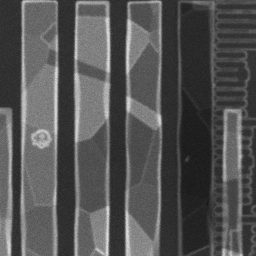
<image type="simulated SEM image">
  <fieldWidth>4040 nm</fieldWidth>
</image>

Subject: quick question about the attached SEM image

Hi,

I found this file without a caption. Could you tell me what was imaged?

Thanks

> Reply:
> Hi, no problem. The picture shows wiring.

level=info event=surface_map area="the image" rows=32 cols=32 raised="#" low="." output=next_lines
...####...###...####..####......
...####...###...####..####......
...####...###...####..####......
...####...###...####..####......
...####...###...####..#####.....
...####...####..####..#####.....
...####...####..####..#####.....
...####...####..####..####......
...####...###...####..#####.....
...####...###...####..#####.....
...####...###...####..#####.....
...####...###...####..#####.....
...####...###...####...####.....
...####...###...####...####.....
#..####...###...####..#####.##..
#..####...###...####..#####.##..
#..####...####..####..#####.##..
#..####...####..####..#####.##..
#..####...####..####..#####.##..
#..####...###...####..#####.##..
#..####...###...####..#####.##..
#..####...###...####..#####.##..
#..####...###...####..#####.##..
#..####...###...####..#####.##..
#..####...###...####..####..##..
#..####...###...####..####..##..
#..####...###...####..####..##..
#..####...###...####..####..##..
#..####...###...####...###..##..
#..####...###...####...###..#...
#..####...###...####...###..#...
#..####...###...###....###..#...